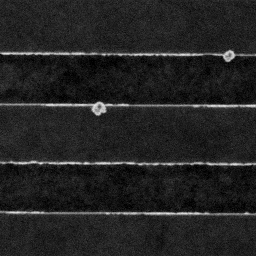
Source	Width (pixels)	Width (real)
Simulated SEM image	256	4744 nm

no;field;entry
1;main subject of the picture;lines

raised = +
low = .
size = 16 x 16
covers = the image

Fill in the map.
++++++++++++++++
++++++++++++++++
++++++++++++++++
..............+.
................
................
......+.........
++++++++++++++++
++++++++++++++++
++++++++++++++++
................
................
................
++++++++++++++++
++++++++++++++++
++++++++++++++++